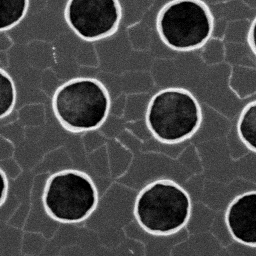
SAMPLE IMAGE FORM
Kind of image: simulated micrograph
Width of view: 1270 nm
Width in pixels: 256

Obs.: holes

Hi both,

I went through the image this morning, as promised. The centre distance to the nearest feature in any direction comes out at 459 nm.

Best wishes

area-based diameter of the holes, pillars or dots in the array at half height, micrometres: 0.251